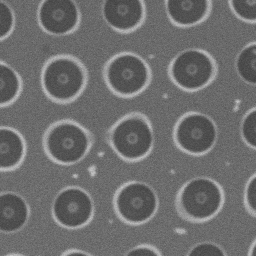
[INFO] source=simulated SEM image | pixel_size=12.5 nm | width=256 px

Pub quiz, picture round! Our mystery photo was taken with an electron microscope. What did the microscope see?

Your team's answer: an array of small figures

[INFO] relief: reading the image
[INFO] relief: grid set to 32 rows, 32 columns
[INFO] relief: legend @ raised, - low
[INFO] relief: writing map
-@@@@----@@@@-----@@@-----@@@---
-@@@@-----@@@-----@@@-----@@@---
--@@@-----@@@-----@@@@---@@@@@@-
-@@@@----@@@@@---@@@@@@@@@@@@@@@
-@@@@@@@@@@@@@@@@@@@@@@@@@@@@@@@
@@@@@@@@@@@@@@@@@@@@@@@@@@@@@@@@
@@@@@@@@@@@@@@@@@@@@@@@--@@@@@--
@@@@@@@--@@@@@----@@@@----@@@@--
-@@@@@----@@@-----@@@------@@@--
--@@@------@@------@@------@@@--
--@@@-----@@@@----@@@@----@@@@@@
--@@@@----@@@@---@@@@@@@@@@@@@@@
--@@@@@--@@@@@@@@@@@@@@@@@@@@@@@
@@@@@@@@@@@@@@@@@@@@@@@@@@@@@@@@
@@@@@@@@@@@@@@@@-@@@@@@--@@@@@@-
@@@@@@@--@@@@@@----@@@-----@@@--
--@@@@-----@@@-----@@@-----@@@--
---@@@-----@@@-----@@@-----@@@@-
---@@@-----@@@-----@@@@---@@@@@@
---@@@----@@@@@---@@@@@@@@@@@@@@
--@@@@@@@@@@@@@@@@@@@@@@@@@@@@@@
@@@@@@@@@@@@@@@@@@@@@@@@@@@@@@@@
@@@@@@@@@@@@@@@@@@@@@@@@--@@@@@-
@@@@@@@@@@@@@@@----@@@@----@@@@-
--@@@@@----@@@@----@@@------@@@-
---@@@@----@@@------@@------@@@-
---@@@@----@@@@----@@@@----@@@@@
---@@@@----@@@@@--@@@@@@@@@@@@@@
---@@@@@@@@@@@@@@@@@@@@@@@@@@@@@
@@@@@@@@@@@@@@@@@@@@@@@@@@@@@@@@
@@@@@@@@@@@@@@@@@@@@@@@@@-@@@@@@
@@@@@@@@@-@@@@@@----@@@@----@@@-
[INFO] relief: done